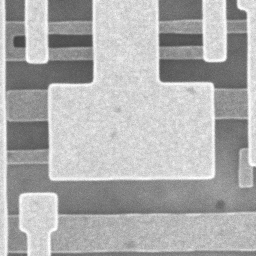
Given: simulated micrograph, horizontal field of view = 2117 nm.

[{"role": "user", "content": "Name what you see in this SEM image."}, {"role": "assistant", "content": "wiring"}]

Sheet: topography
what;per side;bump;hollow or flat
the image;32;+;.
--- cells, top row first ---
+..+++......++++++++.....+++..++
+..+++......++++++++.....+++...+
+..+++......++++++++.....+++...+
+..+++......++++++++.....+++...+
+..+++......++++++++......++...+
+..+++......++++++++......++...+
+..+++......++++++++......++...+
+..+++......++++++++......++...+
+...........++++++++...........+
+...........++++++++...........+
+..........+++++++++++++++.....+
+.....+++++++++++++++++++++....+
+.....+++++++++++++++++++++....+
+.....+++++++++++++++++++++....+
+.....+++++++++++++++++++++....+
+.....+++++++++++++++++++++....+
+.....+++++++++++++++++++++....+
+.....+++++++++++++++++++++....+
+.....+++++++++++++++++++++....+
+.....+++++++++++++++++++++....+
+.....+++++++++++++++++++++....+
+.....+++++++++++++++++++++.....
+......+++++....................
+...............................
+..++++.........................
+.+++++.........................
+.+++++.........................
+.+++++.........................
+.+++++.........................
+..+++..........................
+..+++..........................
+...++..........................